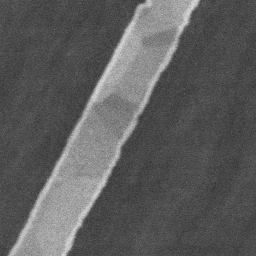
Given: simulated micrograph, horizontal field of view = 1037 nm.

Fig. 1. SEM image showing one or a few lines or trenches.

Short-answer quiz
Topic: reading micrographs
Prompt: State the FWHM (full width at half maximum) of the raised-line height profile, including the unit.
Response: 0.188 um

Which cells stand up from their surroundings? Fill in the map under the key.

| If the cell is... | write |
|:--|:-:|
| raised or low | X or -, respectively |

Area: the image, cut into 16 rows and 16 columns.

---------XXX----
--------XXX-----
--------XXX-----
-------XXXX-----
-------XXX------
------XXX-------
------XXX-------
-----XXX--------
-----XXX--------
----XXX---------
----XXX---------
---XXX----------
--XXXX----------
--XXX-----------
--XXX-----------
-XXX------------